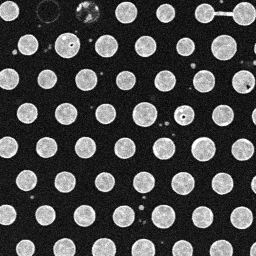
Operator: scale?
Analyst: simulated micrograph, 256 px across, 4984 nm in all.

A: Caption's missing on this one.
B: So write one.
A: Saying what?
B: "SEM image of a regular array of raised bodies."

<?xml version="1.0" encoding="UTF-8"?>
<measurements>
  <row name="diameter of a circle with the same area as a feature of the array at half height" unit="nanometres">404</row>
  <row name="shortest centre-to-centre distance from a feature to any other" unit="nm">758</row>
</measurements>